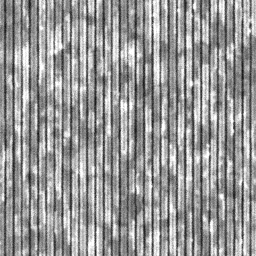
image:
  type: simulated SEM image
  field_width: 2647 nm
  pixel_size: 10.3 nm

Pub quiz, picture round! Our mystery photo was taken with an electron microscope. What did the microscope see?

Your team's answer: parallel lines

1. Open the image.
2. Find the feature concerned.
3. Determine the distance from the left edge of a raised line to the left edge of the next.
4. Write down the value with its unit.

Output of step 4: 0.0846 µm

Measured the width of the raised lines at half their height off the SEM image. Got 5.63 px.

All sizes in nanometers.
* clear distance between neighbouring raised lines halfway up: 29.7